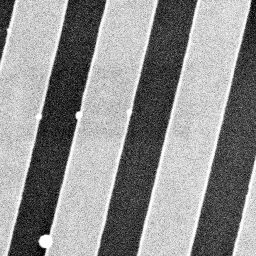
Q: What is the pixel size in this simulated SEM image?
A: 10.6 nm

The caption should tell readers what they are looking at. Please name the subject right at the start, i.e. lines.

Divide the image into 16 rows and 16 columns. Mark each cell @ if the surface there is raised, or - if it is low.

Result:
-@@@---@@@--@@@@
-@@@--@@@---@@@-
@@@@--@@@---@@@-
@@@---@@@---@@@-
@@@---@@@--@@@@-
@@@--@@@@--@@@--
@@@--@@@---@@@--
@@---@@@---@@@--
@@---@@@--@@@@--
@@--@@@@--@@@---
@@--@@@---@@@---
@@--@@@---@@@---
@---@@@--@@@@--@
@--@@@@--@@@---@
@--@@@---@@@---@
@--@@@---@@@---@